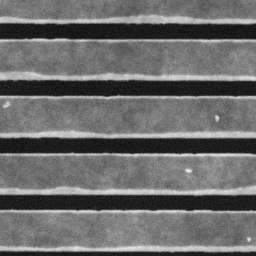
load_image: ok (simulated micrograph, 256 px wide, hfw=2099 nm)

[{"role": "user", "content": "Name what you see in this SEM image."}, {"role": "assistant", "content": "lines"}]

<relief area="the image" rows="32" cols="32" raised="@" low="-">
@@@@@@@@@@@@@@@@@@@@@@@@@@@@@@@@
@@@@@@@@@@@@@@@@@@@@@@@@@@@@@@@@
@@@@@@@@@@@@@@@@@@-@@@@@@@@@@@@@
--------------------------------
--------------------------------
@@@@@@@@@@@@@@@@@@@@@@@@@@@@@@@@
@@@@@@@@@@@@@@@@@@@@@@@@@@@@@@@@
@@@@@@@@@@@@@@@@@@@@@@@@@@@@@@@@
@@@@@@@@@@@@@@@@@@@@@@@@@@@@@@@@
@@@@@@@@@@@@@@@@@@@@@@@@@@@@@@@@
--------------------------------
--------------------------------
@@@@@@@@@@@@@@@@@@@@@@@@@@@@@@@@
@@@@@@@@@@@@@@@@@@@@@@@@@@@@@@@@
@@@@@@@@@@@@@@@@@@@@@@@@@@@@@@@@
@@@@@@@@@@@@@@@@@@@@@@@@@@@@@@@@
@@@@@@@@@@@@@@@@@@@@@@@@@@@@@@@@
--------------------------------
--------------------------------
@@@@@@@@@@@@@@@@@@@@@@@@@@@@@@@@
@@@@@@@@@@@@@@@@@@@@@@@@@@@@@@@@
@@@@@@@@@@@@@@@@@@@@@@@@@@@@@@@@
@@@@@@@@@@@@@@@@@@@@@@@@@@@@@@@@
@@@@@@@@@@@@@@@@@@@@@@@@@@@@@@@@
--------------------------------
--------------------------------
@@@@@@@@@@@@@@@@@@@@@@@@@@@@@@@@
@@@@@@@@@@@@@@@@@@@@@@@@@@@@@@@@
@@@@@@@@@@@@@@@@@@@@@@@@@@@@@@@@
@@@@@@@@@@@@@@@@@@@@@@@@@@@@@@@@
@@@@@@@@@@@@@@@@@@@@@@@@@@@@@@@@
--------------------------------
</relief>